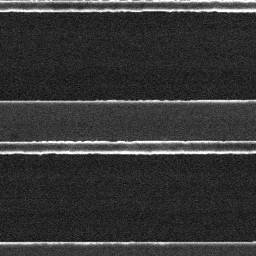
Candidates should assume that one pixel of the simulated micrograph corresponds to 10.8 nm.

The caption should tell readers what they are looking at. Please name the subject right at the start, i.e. lines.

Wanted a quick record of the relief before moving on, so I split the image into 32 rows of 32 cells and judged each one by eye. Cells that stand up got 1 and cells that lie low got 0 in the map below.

11111111111111111111111111111111
00000000000000000000000000000000
00000000000000000000000000000000
00000000000000000000000000000000
00000000000000000000000000000000
00000000000000000000000000000000
00000000000000000000000000000000
00000000000000000000000000000000
00000000000000000000000000000000
00000000000000000000000000000000
00000000000000000000000000000000
00000000000000000000000000000000
00000000000000000000000000000000
11111111111111111111111111111111
11111111111111111111111111111111
11111111111111111111111111111111
11111111111111111111111111111111
11111111111111111111111111111111
11111111111111111111111111111111
00000000000000000000000000000000
00000000000000000000000000000000
00000000000000000000000000000000
00000000000000000000000000000000
00000000000000000000000000000000
00000000000000000000000000000000
00000000000000000000000000000000
00000000000000000000000000000000
00000000000000000000000000000000
00000000000000000000000000000000
00000000000000000000000000000000
11111111111111111111111111111111
11111111111111111111111111111111